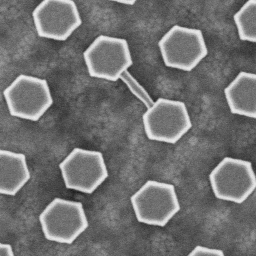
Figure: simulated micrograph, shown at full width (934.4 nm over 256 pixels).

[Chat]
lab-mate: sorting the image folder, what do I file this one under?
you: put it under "raised bodies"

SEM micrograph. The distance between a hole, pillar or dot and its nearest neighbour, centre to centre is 287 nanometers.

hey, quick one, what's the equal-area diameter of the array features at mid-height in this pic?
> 0.155 µm